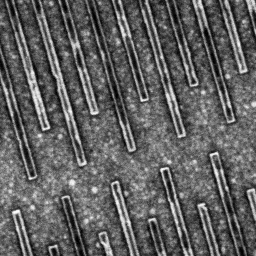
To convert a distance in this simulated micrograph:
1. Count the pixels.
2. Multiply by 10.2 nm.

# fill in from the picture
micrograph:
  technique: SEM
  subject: parallel lines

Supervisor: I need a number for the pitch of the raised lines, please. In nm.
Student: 262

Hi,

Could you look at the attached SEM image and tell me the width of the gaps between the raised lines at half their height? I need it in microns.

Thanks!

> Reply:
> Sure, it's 0.186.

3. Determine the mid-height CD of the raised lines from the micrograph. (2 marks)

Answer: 77.2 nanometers